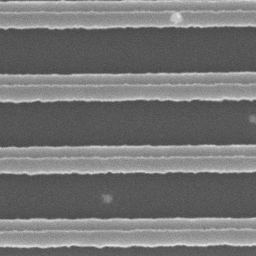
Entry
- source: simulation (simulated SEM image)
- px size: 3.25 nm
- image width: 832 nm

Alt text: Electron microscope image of lines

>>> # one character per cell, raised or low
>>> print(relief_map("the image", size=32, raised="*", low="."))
********************************
********************************
********************************
***...**...***..................
................................
................................
................................
................................
................................
********************************
********************************
********************************
*****************.*.****.***....
................................
................................
................................
................................
................................
.*.*****************************
********************************
********************************
*********.***.**..***...........
................................
................................
................................
................................
................................
..........******.***************
********************************
********************************
***************************..***
................................